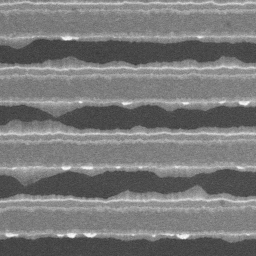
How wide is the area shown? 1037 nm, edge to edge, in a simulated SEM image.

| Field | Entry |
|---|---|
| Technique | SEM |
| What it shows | lines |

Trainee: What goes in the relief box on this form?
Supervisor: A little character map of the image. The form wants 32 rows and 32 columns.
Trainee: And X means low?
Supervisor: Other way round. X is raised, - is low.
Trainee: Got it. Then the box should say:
XXXXXXXXXXXXXXXXXXXXXXXXXXXXXXXX
XXXXXXXXXXXXXXXXXXXXXXXXXXXXXXXX
XXXXXXXXXXXXXXXXXXXXXXXXXXXXXXXX
XXXXXXXXXXXXXXXXXXXXXXXXXXXXXXXX
XXXXXXXXXXXXXXXXXXXXXXXXXXXXXXXX
--------------------------------
--------------------------------
--------------------------------
XXXXXXXXXXXXXXXXXXXXXXXXXXXXXXXX
XXXXXXXXXXXXXXXXXXXXXXXXXXXXXXXX
XXXXXXXXXXXXXXXXXXXXXXXXXXXXXXXX
XXXXXXXXXXXXXXXXXXXXXXXXXXXXXXXX
XXXXXXXXXXXXXXXXXXXXXXXXXXXXXXXX
--------------------------------
--------------------------------
--------------------------------
XXXXXXXXX--------X--X----X----X-
XXXXXXXXXXXXXXXXXXXXXXXXXXXXXXXX
XXXXXXXXXXXXXXXXXXXXXXXXXXXXXXXX
XXXXXXXXXXXXXXXXXXXXXXXXXXXXXXXX
XXXXXXXXXXXXXXXXXXXXXXXXXXXXXXXX
--------------------------------
--------------------------------
--------------------------------
--------------------------------
XXXXXXXXXXXXXXXXXXXXXXXXXXXXXXXX
XXXXXXXXXXXXXXXXXXXXXXXXXXXXXXXX
XXXXXXXXXXXXXXXXXXXXXXXXXXXXXXXX
XXXXXXXXXXXXXXXXXXXXXXXXXXXXXXXX
-X-----XX--X-------X--XX--------
--------------------------------
--------------------------------